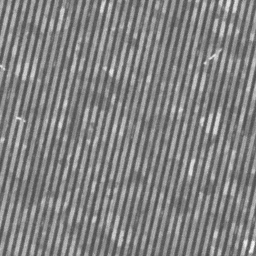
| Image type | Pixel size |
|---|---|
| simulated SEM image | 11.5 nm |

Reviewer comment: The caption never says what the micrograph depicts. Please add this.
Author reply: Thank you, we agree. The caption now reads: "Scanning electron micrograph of parallel lines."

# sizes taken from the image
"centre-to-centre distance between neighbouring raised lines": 87.9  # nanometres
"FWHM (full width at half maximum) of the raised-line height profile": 33.8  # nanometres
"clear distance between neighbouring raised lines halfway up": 5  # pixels